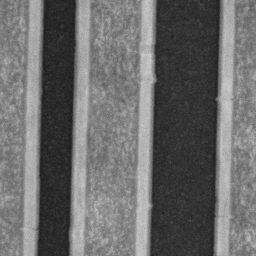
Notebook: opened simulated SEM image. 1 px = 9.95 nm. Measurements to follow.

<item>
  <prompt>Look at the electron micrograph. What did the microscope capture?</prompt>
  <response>one or a few lines or trenches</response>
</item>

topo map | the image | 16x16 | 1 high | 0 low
1100011110000011
1100011110000011
1100011110000011
1100011110000011
1100011110000011
1100011110000011
1100011110000011
1100011110000011
1100011110000011
1100011110000011
1100011110000011
1100011110000011
1100011110000011
1100011110000011
1100011110000011
1100011110000011